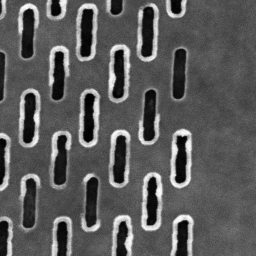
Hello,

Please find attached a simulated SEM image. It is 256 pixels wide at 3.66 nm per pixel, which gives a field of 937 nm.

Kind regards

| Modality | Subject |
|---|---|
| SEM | a regular array of holes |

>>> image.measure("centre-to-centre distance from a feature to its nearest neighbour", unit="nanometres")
186